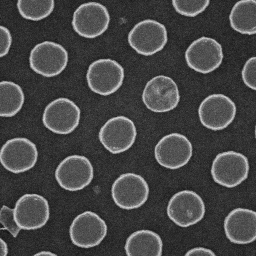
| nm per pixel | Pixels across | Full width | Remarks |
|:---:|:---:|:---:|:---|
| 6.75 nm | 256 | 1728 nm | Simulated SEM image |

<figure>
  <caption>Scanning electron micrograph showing a regular array of raised bodies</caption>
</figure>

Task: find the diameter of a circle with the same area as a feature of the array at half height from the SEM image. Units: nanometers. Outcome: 238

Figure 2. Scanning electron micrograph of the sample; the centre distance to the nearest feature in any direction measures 393 nanometres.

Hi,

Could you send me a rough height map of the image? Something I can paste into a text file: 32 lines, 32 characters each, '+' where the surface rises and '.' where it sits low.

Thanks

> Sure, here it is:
..+++++....+..........++++....++
...+++...++++.........+++....+++
.........+++++...............+++
.........++++....+++.........+++
+..........+....+++++...........
+....++.........+++++...+++.....
+...++++.........++....+++++....
....++++.....+.........+++++...+
....++++...++++.........+++....+
...........++++...............++
++.........++++...++++.........+
+++.........++....++++..........
+++....+..........++++....+++...
+++...++++.........+++...++++...
.....+++++...............++++...
......++++...++++........++++...
.......++....++++...............
..+..........++++...+++.........
++++.........+++...+++++........
+++++..............+++++...+++..
++++....+++.........+++....++++.
.......+++++...............++++.
.......++++....+++.........+++..
........++....++++..............
...++.........++++....+++.......
..++++.........+++...++++.......
..++++...............++++....+++
..++++...++++.........+++...++++
...++....++++...............++++
.........++++...++++........++++
+........+++....++++............
+...............++++....++......